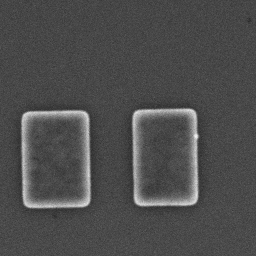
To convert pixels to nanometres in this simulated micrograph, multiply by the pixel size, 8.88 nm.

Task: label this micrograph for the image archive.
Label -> wiring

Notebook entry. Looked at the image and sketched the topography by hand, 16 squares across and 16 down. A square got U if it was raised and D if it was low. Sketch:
DDDDDDDDDDDDDDDD
DDDDDDDDDDDDDDDD
DDDDDDDDDDDDDDDD
DDDDDDDDDDDDDDDD
DDDDDDDDDDDDDDDD
DDDDDDDDDDDDDDDD
DDDDDDDDDDDDDDDD
DUUUUUDDUUUUDDDD
DUUUUUDDUUUUDDDD
DUUUUUDDUUUUDDDD
DUUUUUDDUUUUDDDD
DUUUUUDDUUUUDDDD
DDUUUUDDDUUUDDDD
DDDDDDDDDDDDDDDD
DDDDDDDDDDDDDDDD
DDDDDDDDDDDDDDDD